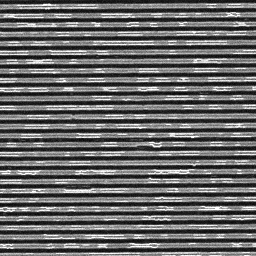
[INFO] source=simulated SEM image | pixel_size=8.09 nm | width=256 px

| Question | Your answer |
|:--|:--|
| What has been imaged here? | parallel lines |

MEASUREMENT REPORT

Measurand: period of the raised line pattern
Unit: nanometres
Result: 74.6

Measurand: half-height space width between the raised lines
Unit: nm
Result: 38.4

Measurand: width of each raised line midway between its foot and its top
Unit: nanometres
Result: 38.4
